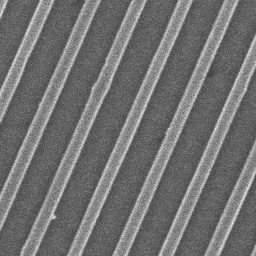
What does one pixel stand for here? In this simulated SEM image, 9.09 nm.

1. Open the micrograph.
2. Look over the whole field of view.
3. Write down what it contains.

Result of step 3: parallel lines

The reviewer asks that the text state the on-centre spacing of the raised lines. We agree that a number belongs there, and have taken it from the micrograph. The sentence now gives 384 nm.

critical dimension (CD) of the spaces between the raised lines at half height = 270 nm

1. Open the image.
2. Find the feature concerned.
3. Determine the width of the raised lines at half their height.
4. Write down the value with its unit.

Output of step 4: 109 nanometers